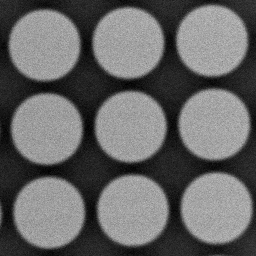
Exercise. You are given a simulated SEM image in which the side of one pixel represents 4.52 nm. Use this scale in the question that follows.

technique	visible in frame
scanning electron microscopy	an array of small figures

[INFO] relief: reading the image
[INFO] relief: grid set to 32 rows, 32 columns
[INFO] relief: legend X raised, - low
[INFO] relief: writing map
--------------------------------
----XXX-------XXXX------XXXXX---
---XXXXXX----XXXXXX----XXXXXXX--
--XXXXXXX---XXXXXXXX--XXXXXXXXX-
-XXXXXXXXX--XXXXXXXX--XXXXXXXXX-
-XXXXXXXXX--XXXXXXXX--XXXXXXXXX-
-XXXXXXXXX--XXXXXXXX--XXXXXXXXX-
--XXXXXXXX--XXXXXXXX---XXXXXXX--
--XXXXXXX----XXXXXX-----XXXXX---
---XXXXX-------XXX--------------
--------------------------------
----------------X--------XXX----
---XXXXX------XXXXX-----XXXXXX--
--XXXXXXX----XXXXXXX---XXXXXXXX-
--XXXXXXXX--XXXXXXXXX--XXXXXXXX-
--XXXXXXXX--XXXXXXXXX-XXXXXXXXX-
--XXXXXXXX--XXXXXXXXX-XXXXXXXXX-
--XXXXXXXX--XXXXXXXX---XXXXXXXX-
--XXXXXXXX---XXXXXXX----XXXXXX--
---XXXXXX-----XXXXX------XXXX---
--------------------------------
--------------------------------
-----XXX------XXXXX-----XXXXXX--
---XXXXXX----XXXXXXX---XXXXXXXX-
--XXXXXXXX---XXXXXXXX--XXXXXXXX-
--XXXXXXXX--XXXXXXXXX--XXXXXXXX-
--XXXXXXXXX-XXXXXXXXX--XXXXXXXX-
--XXXXXXXX--XXXXXXXXX--XXXXXXXX-
--XXXXXXXX---XXXXXXX---XXXXXXXX-
---XXXXXX-----XXXXXX----XXXXXX--
----XXXX-------XXX--------------
--------------------------------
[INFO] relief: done